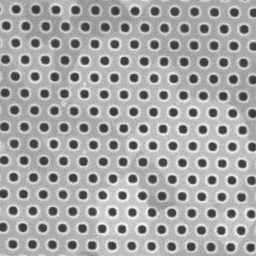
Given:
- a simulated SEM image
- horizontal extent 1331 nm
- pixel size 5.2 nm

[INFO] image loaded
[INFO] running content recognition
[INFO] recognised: a regular array of holes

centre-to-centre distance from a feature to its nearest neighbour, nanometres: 100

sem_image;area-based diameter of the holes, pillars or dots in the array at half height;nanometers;51.8